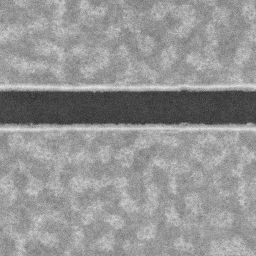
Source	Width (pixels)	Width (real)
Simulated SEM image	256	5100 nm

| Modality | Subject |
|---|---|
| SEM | one or a few lines or trenches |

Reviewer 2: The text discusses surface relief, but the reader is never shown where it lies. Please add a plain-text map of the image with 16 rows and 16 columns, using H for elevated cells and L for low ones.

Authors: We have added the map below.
HHHHHHHHHHHHHHHH
HHHHHHHHHHHHHHHH
HHHHHHHHHHHHHHHH
HHHHHHHHHHHHHHHH
HHHHHHHHHHHHHHHH
LLLLLLLLLLLLLLLL
LLLLLLLLLLLLLLLL
LLLLLLLLLLLLLLLL
HHHHHHHHHHHHHHHH
HHHHHHHHHHHHHHHH
HHHHHHHHHHHHHHHH
HHHHHHHHHHHHHHHH
HHHHHHHHHHHHHHHH
HHHHHHHHHHHHHHHH
HHHHHHHHHHHHHHHH
HHHHHHHHHHHHHHHH